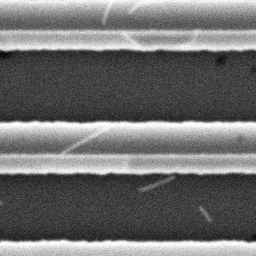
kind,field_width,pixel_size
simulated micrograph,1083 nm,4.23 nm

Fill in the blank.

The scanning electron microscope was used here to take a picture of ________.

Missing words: lines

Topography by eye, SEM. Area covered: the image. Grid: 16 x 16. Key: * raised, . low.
****************
****************
****************
................
................
................
................
................
****************
****************
****************
................
................
................
................
****************